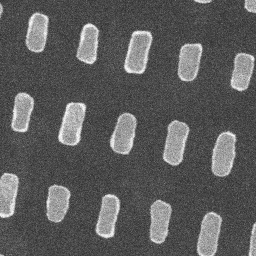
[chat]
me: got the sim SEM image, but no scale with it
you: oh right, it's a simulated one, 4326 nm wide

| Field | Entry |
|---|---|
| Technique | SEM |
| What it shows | a regular array of raised bodies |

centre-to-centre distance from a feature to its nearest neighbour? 875 nm